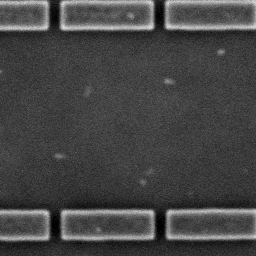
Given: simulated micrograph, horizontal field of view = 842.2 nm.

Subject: wiring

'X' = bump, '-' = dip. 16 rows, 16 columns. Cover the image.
XXX-XXXXXXXXXXXX
XXX-XXXXX-XXXXXX
----------------
----------------
----------------
----------------
----------------
----------------
----------------
----------------
----------------
----------------
----------------
XXX-XXXXXXXXXXXX
XXX-XXXXXXXXXXXX
----------------